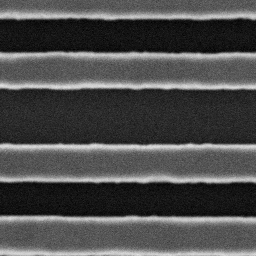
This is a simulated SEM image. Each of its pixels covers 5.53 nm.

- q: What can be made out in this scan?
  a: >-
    lines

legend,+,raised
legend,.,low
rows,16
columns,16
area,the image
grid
++++++++++++++++
................
................
++++++++++++++++
++++++++++++++++
+..++...+.++++++
................
................
................
++++++++++++++++
++++++++++++++++
................
................
................
++++++++++++++++
++++++++++++++++